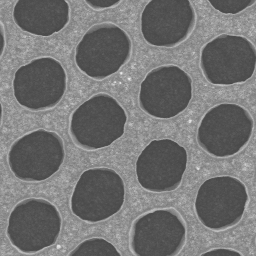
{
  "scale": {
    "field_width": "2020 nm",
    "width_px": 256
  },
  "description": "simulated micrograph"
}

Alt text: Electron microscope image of a regular array of holes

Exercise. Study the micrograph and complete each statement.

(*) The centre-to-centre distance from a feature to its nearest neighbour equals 69.9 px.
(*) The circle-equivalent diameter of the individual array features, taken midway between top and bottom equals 416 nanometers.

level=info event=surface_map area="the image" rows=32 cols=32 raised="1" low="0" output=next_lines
11000000111000111110000011000001
11000000011111111100000011110011
11000000111111111100000011111111
11100000111100011100000011111111
11111111110000001100000111100111
01111111110000001110001111000001
11111111110000001111111110000000
11110001100000001111111110000000
11000000110000011111001110000000
11000000111001111100000111000001
11000000111111111100000011110111
11000000111111111100000011111111
11000001111000111000000011111111
11110111110000011100000111100011
11111111100000001110001111000001
11111111100000001111111110000000
11110011100000011111111110000001
11000000110000111111011110000001
10000000111011111100000111000011
10000000111111111000000111101111
10000000111111111000000111111111
11000001111000111000000111111111
11100111110000011000000111000011
11111111100000001100001110000001
11111111100000001111111110000001
11000011100000011111111100000001
11000001100000011110011110000011
10000000111001111000001110000011
10000000111111111000000111101111
10000001111111111000000111111111
11000001110000111000000111111111
11111111100000011000001111000111